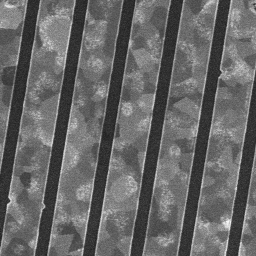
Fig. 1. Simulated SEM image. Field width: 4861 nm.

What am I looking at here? parallel lines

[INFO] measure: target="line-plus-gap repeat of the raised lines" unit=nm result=892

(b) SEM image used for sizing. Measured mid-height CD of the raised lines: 647 nm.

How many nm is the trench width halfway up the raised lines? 244